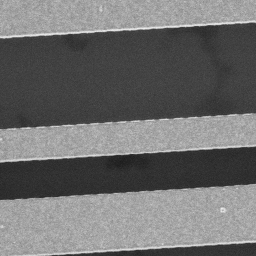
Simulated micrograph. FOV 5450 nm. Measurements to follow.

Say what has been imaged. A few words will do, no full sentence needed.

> lines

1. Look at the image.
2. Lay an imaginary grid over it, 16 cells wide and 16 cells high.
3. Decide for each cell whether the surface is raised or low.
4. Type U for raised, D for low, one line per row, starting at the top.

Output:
UUUUUUUUUUUUUUUU
UUUUUUUUUUUUUUDD
DDDDDDDDDDDDDDDD
DDDDDDDDDDDDDDDD
DDDDDDDDDDDDDDDD
DDDDDDDDDDDDDDDD
DDDDDDDDDDDDDDDD
DDDDDDDDDDUUUUUU
UUUUUUUUUUUUUUUU
UUUUUUUUUUDDDDDD
DDDDDDDDDDDDDDDD
DDDDDDDDDDDDDDDD
DUUUUUUUUUUUUUUU
UUUUUUUUUUUUUUUU
UUUUUUUUUUUUUUUU
UUUUUUUUUUDDDDDD